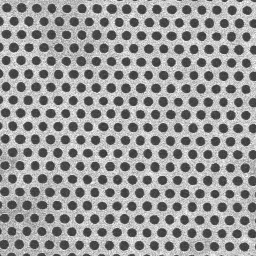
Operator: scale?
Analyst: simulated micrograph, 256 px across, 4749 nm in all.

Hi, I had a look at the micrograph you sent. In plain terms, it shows a regular array of holes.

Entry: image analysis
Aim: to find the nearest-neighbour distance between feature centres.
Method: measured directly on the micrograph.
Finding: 14.8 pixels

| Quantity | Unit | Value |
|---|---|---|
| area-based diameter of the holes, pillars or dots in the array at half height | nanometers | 175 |